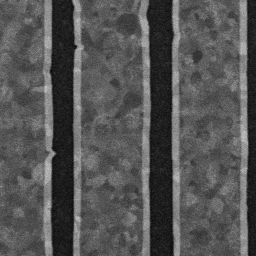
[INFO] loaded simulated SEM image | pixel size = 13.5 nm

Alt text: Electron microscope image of one or a few lines or trenches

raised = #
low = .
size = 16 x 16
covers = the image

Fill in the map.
###..####..####.
###..####..####.
###..####..####.
###..####..####.
###..####..####.
###..####..####.
###..####..####.
###..####..####.
###..####..####.
###..####..####.
###..####..####.
###..####..####.
###..####..####.
###..####..####.
###..####..####.
###..####..####.